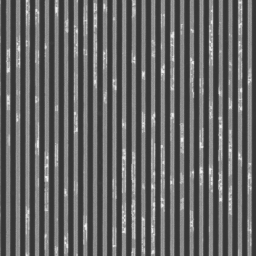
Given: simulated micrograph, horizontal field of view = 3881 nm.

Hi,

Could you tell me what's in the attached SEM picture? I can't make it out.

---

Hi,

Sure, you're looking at parallel lines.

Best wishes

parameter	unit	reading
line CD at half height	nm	72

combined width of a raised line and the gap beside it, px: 9.66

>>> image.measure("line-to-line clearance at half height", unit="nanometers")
72